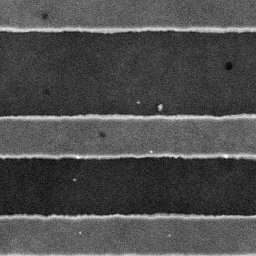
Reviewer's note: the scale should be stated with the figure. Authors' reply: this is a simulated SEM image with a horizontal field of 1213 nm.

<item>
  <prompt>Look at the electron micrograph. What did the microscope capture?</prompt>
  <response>lines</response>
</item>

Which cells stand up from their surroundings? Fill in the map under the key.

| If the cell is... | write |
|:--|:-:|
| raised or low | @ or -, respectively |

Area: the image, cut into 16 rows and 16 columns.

@@@@@@@@@@@@@@@@
@@@@@@@@@@@@@@@@
----------------
----------------
----------------
----------------
----------------
@@@@@@@@@@@@@@@@
@@@@@@@@@@@@@@@@
@@@@@@@@@@@@@@@@
----------------
----------------
----------------
-@---@@@@@@---@@
@@@@@@@@@@@@@@@@
@@@@@@@@@@@@@@@@